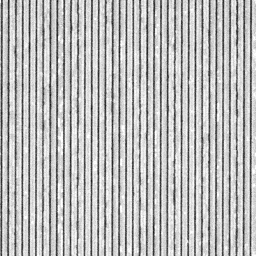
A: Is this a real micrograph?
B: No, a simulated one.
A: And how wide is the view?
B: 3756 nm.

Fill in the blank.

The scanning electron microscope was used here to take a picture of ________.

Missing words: parallel lines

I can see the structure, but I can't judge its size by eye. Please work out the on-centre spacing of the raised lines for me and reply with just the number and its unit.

102 nm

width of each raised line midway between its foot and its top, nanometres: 56.9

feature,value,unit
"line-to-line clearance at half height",0.0422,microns